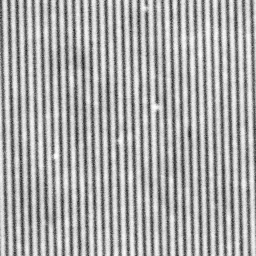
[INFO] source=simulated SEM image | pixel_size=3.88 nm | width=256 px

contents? parallel lines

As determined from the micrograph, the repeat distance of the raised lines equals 8.09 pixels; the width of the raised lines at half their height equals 21.8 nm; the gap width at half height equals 11.2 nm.